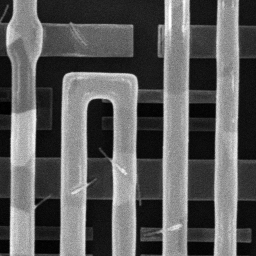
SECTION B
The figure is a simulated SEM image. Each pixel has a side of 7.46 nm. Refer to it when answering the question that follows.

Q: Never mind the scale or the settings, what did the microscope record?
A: wiring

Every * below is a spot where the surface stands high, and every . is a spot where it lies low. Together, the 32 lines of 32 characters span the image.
..***................***...***..
..***................***...***..
.****................***...***..
.****................***...***..
.****................***...***..
.****................***...***..
.****................***...***..
.****................***...***..
.****................***...***..
..**....*********....***...***..
..**....*********....***...***..
.***....*********....***...***..
.***....****..***....***...***..
.****...***...***....***...***..
.****...***...***....***...***..
.****...***...***....***...***..
.***....***...***....***...***..
.***....***...***....***...***..
.***....***...***...***....***..
.***....***...***...***....***..
.***....***...***...***....***..
.***....***...***...***....***..
.***....***...***...***....***..
.***....***...***...***....***..
.***....***...***...***....***..
.***....***...***...***....***..
.***....***...***...***....***..
.***....***...***...***....**...
.***....***...***...***....**...
.***....***...***...***....**...
.***....***...***...***....**...
.***....***...***...***....**...